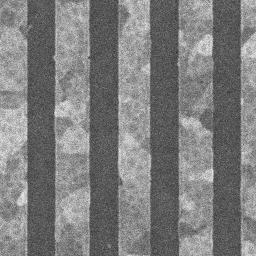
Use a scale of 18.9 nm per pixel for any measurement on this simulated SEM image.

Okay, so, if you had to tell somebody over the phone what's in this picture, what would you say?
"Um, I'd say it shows one or a few lines or trenches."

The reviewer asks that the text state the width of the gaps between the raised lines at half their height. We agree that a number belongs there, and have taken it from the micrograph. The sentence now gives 0.557 microns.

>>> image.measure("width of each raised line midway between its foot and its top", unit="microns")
0.611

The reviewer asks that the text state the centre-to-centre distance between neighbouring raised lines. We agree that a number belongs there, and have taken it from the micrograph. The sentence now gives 1160 nanometers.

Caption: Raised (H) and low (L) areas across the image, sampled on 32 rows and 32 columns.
HHHLLLLHHHHLLLLHHHHLLLHHHHLLLLHH
HHHLLLLHHHHLLLLHHHHLLLHHHHLLLLHH
HHHLLLLHHHHLLLLHHHHLLLHHHHLLLLHH
HHHLLLLHHHHLLLLHHHHLLLLHHHHLLLHH
HHHLLLLHHHHLLLLHHHHLLLHHHHLLLLHH
HHHLLLLHHHHLLLLHHHHLLLHHHHLLLLHH
HHHLLLLHHHHLLLLHHHHLLLHHHHLLLLHH
HHHLLLLHHHHLLLLHHHHLLLHHHHHLLLHH
HHHLLLLHHHHLLLLHHHHLLLHHHHHLLLHH
HHHLLLLHHHHLLLLHHHHLLLHHHHLLLLHH
HHHLLLLHHHHLLLLHHHHLLLHHHHLLLLHH
HHHLLLLHHHHLLLLHHHHLLLHHHHLLLLHH
HHHLLLLHHHHLLLLHHHHLLLHHHHLLLLHH
HHHLLLLHHHHLLLLHHHHLLLHHHHHLLLHH
HHHLLLLHHHHLLLLHHHHLLLHHHHHLLLHH
HHHLLLLHHHHLLLLHHHHLLLHHHHLLLLHH
HHHLLLLHHHHLLLLHHHHLLLLHHHLLLLHH
HHHLLLLHHHHLLLLHHHHLLLLHHHLLLLHH
HHHLLLLHHHHLLLLHHHHLLLHHHHLLLLHH
HHHLLLLHHHHLLLLHHHHLLLHHHHLLLLHH
HHHLLLLHHHHLLLLHHHHLLLHHHHLLLLHH
HHHLLLLHHHHLLLLHHHHLLLLHHHLLLLHH
HHHLLLLHHHHLLLLHHHHLLLLHHHLLLLHH
HHHLLLLHHHHLLLLHHHHLLLLHHHHLLLHH
HHHLLLLHHHHLLLLHHHHLLLLHHHHLLLHH
HHHLLLLHHHHLLLLHHHHLLLLHHHLLLLHH
HHHLLLLHHHHLLLLHHHHLLLHHHHLLLLHH
HHHLLLLHHHHLLLLHHHHLLLHHHHLLLLHH
HHHLLLLHHHHLLLLHHHHLLLHHHHLLLLHH
HHHLLLLHHHHLLLLHHHHLLLHHHHLLLLHH
HHHLLLLHHHHLLLLHHHHLLLLHHHLLLLHH
HHHLLLLHHHHLLLLHHHHLLLLHHHLLLLHH